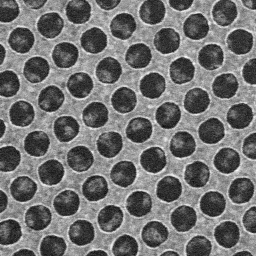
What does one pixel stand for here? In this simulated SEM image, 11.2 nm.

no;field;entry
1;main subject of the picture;a regular array of holes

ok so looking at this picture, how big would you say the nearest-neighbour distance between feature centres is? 362 nanometers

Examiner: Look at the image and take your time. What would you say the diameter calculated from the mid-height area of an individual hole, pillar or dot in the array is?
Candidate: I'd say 27.2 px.